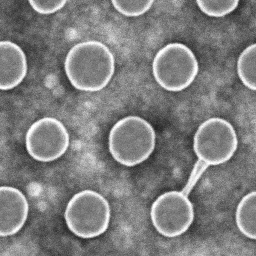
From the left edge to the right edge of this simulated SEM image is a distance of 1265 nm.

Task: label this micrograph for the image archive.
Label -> raised bodies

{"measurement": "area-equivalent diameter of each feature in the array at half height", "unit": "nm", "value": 220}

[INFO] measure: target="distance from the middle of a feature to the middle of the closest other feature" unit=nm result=418